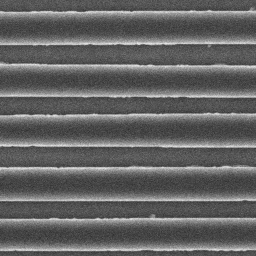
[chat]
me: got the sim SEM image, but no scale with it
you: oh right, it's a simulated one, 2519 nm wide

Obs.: lines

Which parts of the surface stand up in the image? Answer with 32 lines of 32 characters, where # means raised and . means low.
................................
#...###.########################
################################
################################
################################
#####################...........
................................
................................
################################
################################
################################
################################
................................
................................
.######.########################
################################
################################
################################
................................
................................
................................
################################
################################
################################
################################
................................
................................
################################
################################
################################
################################
................................